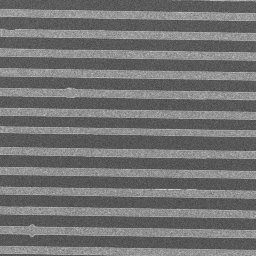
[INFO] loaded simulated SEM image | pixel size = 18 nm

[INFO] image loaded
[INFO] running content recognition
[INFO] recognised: parallel lines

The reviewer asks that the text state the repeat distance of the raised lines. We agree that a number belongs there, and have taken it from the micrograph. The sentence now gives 355 nm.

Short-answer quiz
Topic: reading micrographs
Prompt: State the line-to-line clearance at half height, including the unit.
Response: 218 nanometers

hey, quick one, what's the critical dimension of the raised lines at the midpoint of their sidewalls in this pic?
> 137 nm